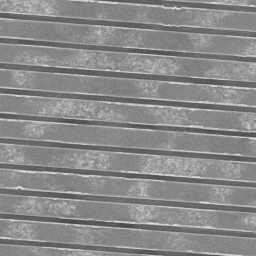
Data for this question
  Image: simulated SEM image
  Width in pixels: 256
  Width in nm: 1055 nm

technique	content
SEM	parallel lines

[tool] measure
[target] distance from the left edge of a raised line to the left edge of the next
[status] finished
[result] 0.103 microns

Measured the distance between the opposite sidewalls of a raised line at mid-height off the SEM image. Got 82.3 nm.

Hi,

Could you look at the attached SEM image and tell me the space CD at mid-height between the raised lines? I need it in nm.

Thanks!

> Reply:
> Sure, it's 23.6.